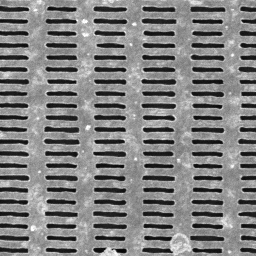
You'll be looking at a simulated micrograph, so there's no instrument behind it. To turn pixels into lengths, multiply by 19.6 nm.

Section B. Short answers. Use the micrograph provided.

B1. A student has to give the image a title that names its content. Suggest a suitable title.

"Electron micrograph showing a regular array of holes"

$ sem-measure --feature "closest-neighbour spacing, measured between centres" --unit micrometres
0.235